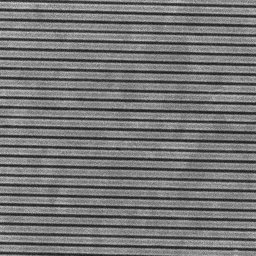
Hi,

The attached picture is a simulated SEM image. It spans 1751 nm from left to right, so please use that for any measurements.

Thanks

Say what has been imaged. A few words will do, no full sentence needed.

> parallel lines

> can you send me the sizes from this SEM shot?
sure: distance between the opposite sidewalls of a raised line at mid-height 43.6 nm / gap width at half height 24.8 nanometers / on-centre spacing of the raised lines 66.5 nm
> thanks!